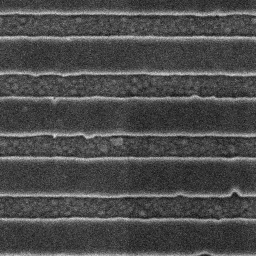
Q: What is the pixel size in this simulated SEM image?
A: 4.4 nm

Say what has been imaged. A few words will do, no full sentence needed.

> parallel lines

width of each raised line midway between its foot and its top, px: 38.6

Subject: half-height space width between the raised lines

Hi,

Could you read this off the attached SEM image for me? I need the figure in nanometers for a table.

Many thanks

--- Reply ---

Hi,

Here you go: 96.2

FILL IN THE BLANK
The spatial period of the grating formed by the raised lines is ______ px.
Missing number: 60.5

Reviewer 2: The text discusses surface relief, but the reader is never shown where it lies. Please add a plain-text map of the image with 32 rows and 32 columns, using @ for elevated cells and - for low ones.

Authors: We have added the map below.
@@@@@@@@@@@@@@@@@@@@@@@@@@@@@@@@
@@@@@@@@@@@@@@@@@@@@@@@@@@@@@@@@
--------------------------------
--------------------------------
--------------------------------
@@@@@@@@@@@@@@@@@@@@@@@@@@@@@@@@
@@@@@@@@@@@@@@@@@@@@@@@@@@@@@@@@
@@@@@@@@@@@@@@@@@@@@@@@@@@@@@@@@
@@@@@@@@@@@@@@@@@@@@@@@@@@@@@@@@
--------------------------------
--------------------------------
--------------------------------
@@@@@@@@@@@@@@@@@@@@@@@@@@@@@@@@
@@@@@@@@@@@@@@@@@@@@@@@@@@@@@@@@
@@@@@@@@@@@@@@@@@@@@@@@@@@@@@@@@
@@@@@@@@@@@@@@@@@@@@@@@@@@@@@@@@
@@@@@@@@@@@@@@@@@@@@@@@@@@@@@@@@
--------------------------------
--------------------------------
--------------------------------
@@@@@@@@@@@@@@@@@@@@@@@@@@@@@@@@
@@@@@@@@@@@@@@@@@@@@@@@@@@@@@@@@
@@@@@@@@@@@@@@@@@@@@@@@@@@@@@@@@
@@@@@@@@@@@@@@@@@@@@@@@@@@@@@@@@
------------@@@@@@@@@@-@@@@@@-@-
--------------------------------
--------------------------------
@@@@@@@@@@@@@@@@@@@@@@@@@@@-@@@@
@@@@@@@@@@@@@@@@@@@@@@@@@@@@@@@@
@@@@@@@@@@@@@@@@@@@@@@@@@@@@@@@@
@@@@@@@@@@@@@@@@@@@@@@@@@@@@@@@@
@@@@@@@@@@@@@@@@@@@@@@@@@@@@@@@@